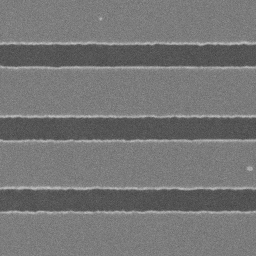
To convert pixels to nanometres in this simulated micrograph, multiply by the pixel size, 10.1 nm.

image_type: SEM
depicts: lines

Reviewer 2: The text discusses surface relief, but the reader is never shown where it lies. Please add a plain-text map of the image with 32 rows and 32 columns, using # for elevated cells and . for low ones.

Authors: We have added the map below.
################################
################################
################################
################################
################################
###########.####################
................................
................................
################################
################################
################################
################################
################################
################################
################################
................................
................................
................................
################################
################################
################################
################################
################################
################################
................................
................................
.#####..#...#####.######.#####.#
################################
################################
################################
################################
################################